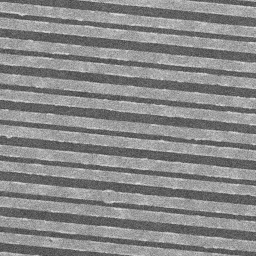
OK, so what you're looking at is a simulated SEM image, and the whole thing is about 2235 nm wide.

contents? parallel lines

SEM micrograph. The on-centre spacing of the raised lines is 155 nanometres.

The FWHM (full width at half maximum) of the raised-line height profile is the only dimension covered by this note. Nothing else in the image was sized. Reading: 87.9 nm